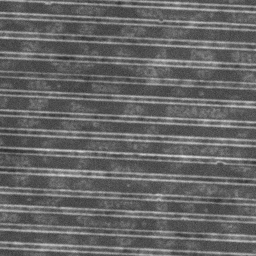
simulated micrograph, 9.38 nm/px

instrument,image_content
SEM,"parallel lines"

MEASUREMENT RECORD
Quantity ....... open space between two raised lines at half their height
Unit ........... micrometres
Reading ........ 0.124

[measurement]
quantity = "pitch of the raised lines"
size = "179 nanometers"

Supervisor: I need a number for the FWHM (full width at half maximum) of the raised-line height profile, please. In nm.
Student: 50.3